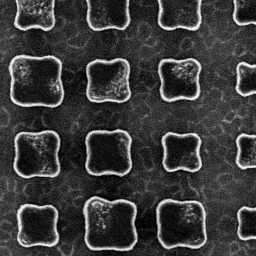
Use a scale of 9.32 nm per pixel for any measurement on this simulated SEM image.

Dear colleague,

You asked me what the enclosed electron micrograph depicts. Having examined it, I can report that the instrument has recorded a regular array of raised bodies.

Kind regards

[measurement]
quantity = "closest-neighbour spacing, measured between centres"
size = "71.3 pixels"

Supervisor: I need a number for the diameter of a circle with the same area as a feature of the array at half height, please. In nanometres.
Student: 454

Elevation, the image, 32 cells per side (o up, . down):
..ooooo....ooooo....ooooo....ooo
..ooooo....ooooo....ooooo....ooo
..ooooo....ooooo....ooooo....ooo
..oo.o......oooo....oo.o........
................................
................................
................................
..ooooo.......o......o.o........
.ooooooo...ooooo....ooooo.....oo
.ooooooo...ooooo....ooooo.....oo
.ooooooo...ooooo....ooooo.....oo
.ooooooo...ooooo....ooooo.....oo
..oooooo...ooooo.....o..........
................................
................................
................................
.....oo.....oooo................
..ooooo....ooooo....ooooo.....oo
..ooooo....ooooo....ooooo.....oo
..ooooo....ooooo.....oooo.....oo
..ooooo....ooooo....ooooo.....oo
..ooooo....ooooo................
................................
................................
................................
...........oooooo...ooooo.......
..ooooo....oooooo...oooooo....oo
..ooooo....oooooo...oooooo....oo
..ooooo....oooooo...oooooo....oo
..ooooo....oooooo...oooooo....oo
...oooo....oooooo...ooooo.......
................................